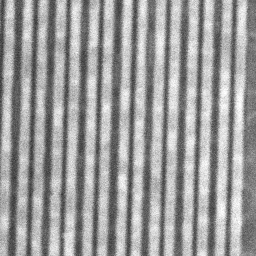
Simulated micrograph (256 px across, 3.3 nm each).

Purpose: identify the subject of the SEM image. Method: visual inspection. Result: parallel lines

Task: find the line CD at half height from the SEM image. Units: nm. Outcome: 26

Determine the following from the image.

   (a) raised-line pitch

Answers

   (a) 54.5 nm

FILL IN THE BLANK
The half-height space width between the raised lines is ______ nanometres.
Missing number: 32.2